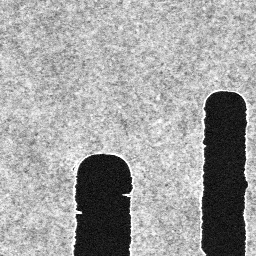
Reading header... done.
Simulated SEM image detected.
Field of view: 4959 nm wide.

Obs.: one or a few lines or trenches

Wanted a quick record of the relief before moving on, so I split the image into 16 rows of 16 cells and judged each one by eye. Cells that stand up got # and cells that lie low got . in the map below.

################
################
################
################
################
################
#############..#
#############..#
#############..#
#############..#
#####...#####..#
#####...#####..#
#####...#####..#
#####...#####..#
#####...#####..#
#####...#####..#